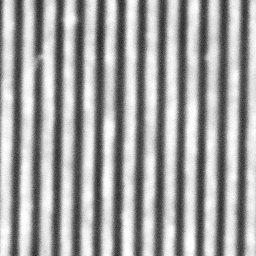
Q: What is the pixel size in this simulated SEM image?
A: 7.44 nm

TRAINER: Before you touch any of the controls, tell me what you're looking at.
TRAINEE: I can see parallel lines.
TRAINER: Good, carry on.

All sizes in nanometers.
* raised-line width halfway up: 72.5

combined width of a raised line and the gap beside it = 153 nm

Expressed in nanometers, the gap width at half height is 80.